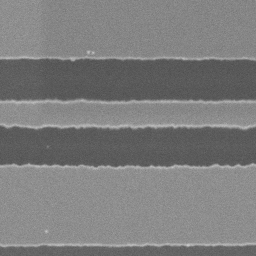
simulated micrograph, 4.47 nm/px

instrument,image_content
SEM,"lines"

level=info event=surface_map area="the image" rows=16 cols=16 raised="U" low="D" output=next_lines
UUUUUUUUUUUUUUUU
UUUUUUUUUUUUUUUU
UUUUUUUUUUUUUUUU
UUUUUUUUUUUUUUUU
DDDDDDDDDDDDDDDD
DDDDDDDDDDDDDDDD
UUUUUUUUUUUUUUUU
UUUUUUUUUUUUUUUU
DDDDDDDDDDDDDDDD
DDDDDDDDDDDDDDDD
UUUUUUUUUUUUUUUU
UUUUUUUUUUUUUUUU
UUUUUUUUUUUUUUUU
UUUUUUUUUUUUUUUU
UUUUUUUUUUUUUUUU
DDDDDDDDDDDDDDDD